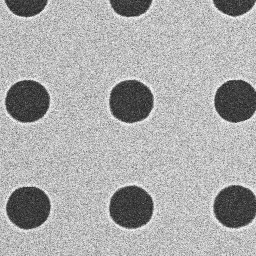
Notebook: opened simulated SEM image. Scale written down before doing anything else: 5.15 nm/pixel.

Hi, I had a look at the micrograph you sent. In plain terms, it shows holes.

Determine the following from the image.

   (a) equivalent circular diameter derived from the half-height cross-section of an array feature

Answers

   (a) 0.225 micrometres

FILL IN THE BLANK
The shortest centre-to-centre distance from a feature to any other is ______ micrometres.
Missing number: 0.532